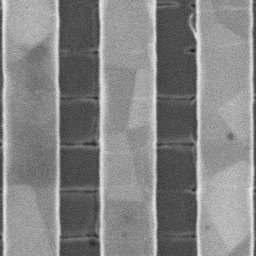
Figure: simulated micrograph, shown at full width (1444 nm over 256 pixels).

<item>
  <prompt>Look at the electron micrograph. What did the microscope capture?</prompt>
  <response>wiring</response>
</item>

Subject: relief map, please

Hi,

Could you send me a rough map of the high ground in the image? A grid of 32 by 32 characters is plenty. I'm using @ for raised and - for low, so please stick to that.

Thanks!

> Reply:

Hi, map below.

@@@@@@@-----@@@@@@@------@@@@@@-
@@@@@@@-----@@@@@@@------@@@@@@-
@@@@@@@------@@@@@@------@@@@@@-
@@@@@@@------@@@@@@------@@@@@@-
@@@@@@@------@@@@@@------@@@@@@-
@@@@@@@-----@@@@@@@------@@@@@@-
@@@@@@@-----@@@@@@@------@@@@@@-
@@@@@@@------@@@@@@------@@@@@@-
@@@@@@@------@@@@@@------@@@@@@-
@@@@@@@------@@@@@@------@@@@@@-
-@@@@@@------@@@@@@------@@@@@@-
@@@@@@@------@@@@@@------@@@@@@@
@@@@@@@------@@@@@@------@@@@@@@
@@@@@@@------@@@@@@------@@@@@@-
@@@@@@@------@@@@@@------@@@@@@-
@@@@@@@------@@@@@@------@@@@@@-
-@@@@@@------@@@@@@------@@@@@@@
-@@@@@@------@@@@@@------@@@@@@@
-@@@@@@------@@@@@@------@@@@@@@
-@@@@@@------@@@@@@------@@@@@@-
@@@@@@@------@@@@@@------@@@@@@@
@@@@@@@------@@@@@@------@@@@@@@
@@@@@@@------@@@@@@------@@@@@@@
-@@@@@@------@@@@@@------@@@@@@@
@@@@@@@------@@@@@@------@@@@@@-
@@@@@@@------@@@@@@------@@@@@@@
-@@@@@@------@@@@@@------@@@@@@@
-@@@@@@------@@@@@@@-----@@@@@@@
-@@@@@@------@@@@@@@-----@@@@@@@
@@@@@@@------@@@@@@------@@@@@@@
-@@@@@@------@@@@@@------@@@@@@@
@@@@@@@------@@@@@@------@@@@@@@